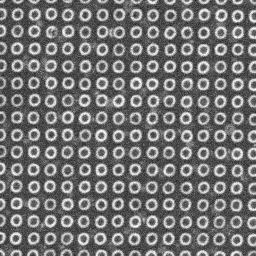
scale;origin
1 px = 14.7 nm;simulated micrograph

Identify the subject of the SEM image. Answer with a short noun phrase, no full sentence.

a regular array of raised bodies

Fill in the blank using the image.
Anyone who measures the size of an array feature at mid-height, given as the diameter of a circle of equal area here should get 154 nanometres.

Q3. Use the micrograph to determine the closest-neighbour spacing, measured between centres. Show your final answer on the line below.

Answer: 243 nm